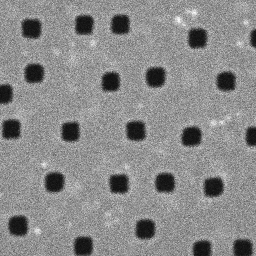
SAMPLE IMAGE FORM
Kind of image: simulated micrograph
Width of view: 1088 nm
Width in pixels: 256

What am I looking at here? a regular array of holes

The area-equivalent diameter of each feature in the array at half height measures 0.0917 um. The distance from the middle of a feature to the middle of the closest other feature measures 210 nm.